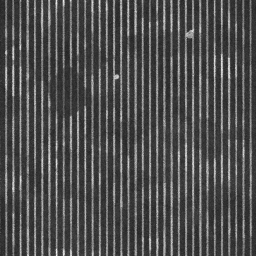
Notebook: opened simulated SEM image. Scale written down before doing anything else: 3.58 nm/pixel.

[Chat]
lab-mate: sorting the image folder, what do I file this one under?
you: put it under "parallel lines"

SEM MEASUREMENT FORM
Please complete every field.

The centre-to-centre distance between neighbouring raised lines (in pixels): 7.21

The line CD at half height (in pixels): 1.62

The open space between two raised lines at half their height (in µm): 0.0201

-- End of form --